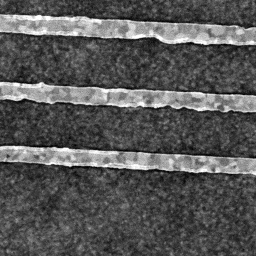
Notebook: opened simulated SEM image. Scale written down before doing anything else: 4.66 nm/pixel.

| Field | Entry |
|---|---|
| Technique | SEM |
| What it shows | one or a few lines or trenches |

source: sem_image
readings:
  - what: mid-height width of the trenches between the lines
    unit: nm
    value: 224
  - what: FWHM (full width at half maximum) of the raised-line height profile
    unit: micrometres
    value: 0.0767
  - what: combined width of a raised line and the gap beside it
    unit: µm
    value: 0.303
